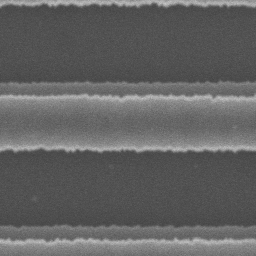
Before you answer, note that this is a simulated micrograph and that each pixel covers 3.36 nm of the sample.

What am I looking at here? lines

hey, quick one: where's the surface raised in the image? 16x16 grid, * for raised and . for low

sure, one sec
................
................
................
................
................
****************
****************
****************
****************
................
................
................
................
................
****************
****************